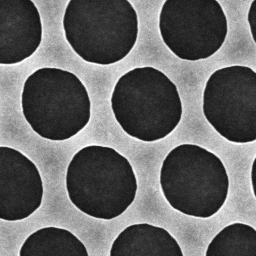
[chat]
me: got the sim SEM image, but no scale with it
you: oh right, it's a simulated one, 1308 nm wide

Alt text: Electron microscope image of holes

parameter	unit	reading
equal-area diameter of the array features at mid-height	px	71.5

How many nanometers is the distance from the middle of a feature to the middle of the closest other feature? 462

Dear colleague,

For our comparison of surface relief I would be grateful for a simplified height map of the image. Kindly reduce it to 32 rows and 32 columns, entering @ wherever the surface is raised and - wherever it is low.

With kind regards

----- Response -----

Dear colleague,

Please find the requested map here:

----@@@@--------@@@@-------@@@@-
-----@@@---------@@@--------@@@-
-----@@@---------@@@--------@@@-
-----@@@---------@@@--------@@@-
-----@@@---------@@@--------@@@@
-----@@@@--------@@@@-------@@@@
----@@@@@-------@@@@@@-----@@@@@
---@@@@@@@-----@@@@@@@@@-@@@@@@@
@@@@@@@@@@@@@@@@@--@@@@@@@@@---@
@@@@-----@@@@@@------@@@@@------
@@@-------@@@@--------@@@@------
@@@--------@@@--------@@@-------
@@@--------@@@---------@@-------
@@@--------@@@---------@@-------
@@@--------@@@---------@@@------
@@@@-------@@@@-------@@@@------
@@@@------@@@@@@-----@@@@@@-----
@@@@@@@-@@@@@@@@@---@@@@@@@@@---
-@@@@@@@@@----@@@@@@@@---@@@@@@@
---@@@@@@------@@@@@@------@@@@@
----@@@@@-------@@@@--------@@@@
-----@@@---------@@@--------@@@-
-----@@@---------@@@---------@@-
-----@@@---------@@@---------@@@
-----@@@@--------@@@@-------@@@@
-----@@@@-------@@@@@-------@@@@
----@@@@@@-----@@@@@@@@----@@@@@
@-@@@@@@@@@@@@@@@@@@@@@@@@@@@@@@
@@@@@--@@@@@@@@@----@@@@@@@@----
@@@@-----@@@@@@------@@@@@@-----
@@@-------@@@@--------@@@@------
@@---------@@@---------@@@------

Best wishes